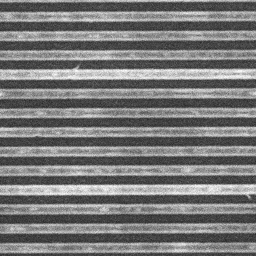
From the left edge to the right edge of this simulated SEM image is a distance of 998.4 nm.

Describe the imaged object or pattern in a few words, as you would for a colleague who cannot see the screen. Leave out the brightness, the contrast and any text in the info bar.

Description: parallel lines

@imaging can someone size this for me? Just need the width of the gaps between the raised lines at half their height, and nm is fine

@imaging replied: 40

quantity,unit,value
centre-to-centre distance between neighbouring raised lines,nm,75.1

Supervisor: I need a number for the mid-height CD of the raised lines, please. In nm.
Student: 32.6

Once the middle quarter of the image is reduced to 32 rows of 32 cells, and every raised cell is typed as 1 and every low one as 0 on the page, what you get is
00000000000000000000000000000000
00100000000000000000000000000000
11111111111111111111111111111111
11111100111111111111111111111111
00000000000000000000000000000000
00000000000000000000000000000000
11111111111111111111111111111111
11111111111111111111111111111111
11100000000000000000000000000000
00000000000000000000000000000000
00000000000000000000000000000000
11111111111111111111111111111111
11111111111111111111111111111111
00000000000000000000000000000000
00000000000000000000000000000000
00000000000000000000000000000000
11111111111111111111111111111111
11111111111111111111111111111111
00000000000000000000000000000000
00000000000000000000000000000000
00000000000000000000000000000000
11111111111111111111111111111111
11111111111111111111111111111111
00000000000000000000000000000000
00000000000000000000000000000000
00000000000000000000000000000000
11111111111111111111111111111111
11111111111111111111111111111111
00000000000000000000000000000000
00000000000000000000000000000000
11111111111111111111111111111111
11111111111111111111111111111111